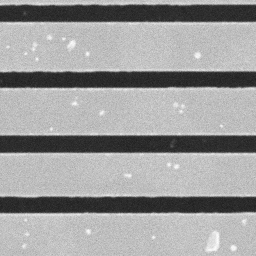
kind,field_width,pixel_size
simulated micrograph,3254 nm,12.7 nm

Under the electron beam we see lines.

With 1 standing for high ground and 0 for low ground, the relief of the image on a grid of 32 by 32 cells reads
11111111111111110001011100000000
00000000000000000000000000000000
00000000000000000000000000000000
11111111111111111111111111111111
11111111111111111111111111111111
11111111111111111111111111111111
11111111111111111111111111111111
11111111111111111111111111111111
11111111111111111111111111111111
00000000000000000000000000000000
00000000000000000000000000000000
11111111111111111111111111111111
11111111111111111111111111111111
11111111111111111111111111111111
11111111111111111111111111111111
11111111111111111111111111111111
11111111111111111111111111111111
00000000000000000000000000000000
00000000000000000000000000000000
11111111111111111111111111111111
11111111111111111111111111111111
11111111111111111111111111111111
11111111111111111111111111111111
11111111111111111111111111111111
10111000111110100011001000000010
00000000000000000000000000000000
00000000000000000000000000000000
11111111111111111111111111111111
11111111111111111111111111111111
11111111111111111111111111111111
11111111111111111111111111111111
11111111111111111111111111111111